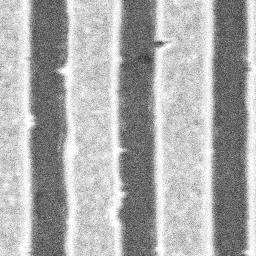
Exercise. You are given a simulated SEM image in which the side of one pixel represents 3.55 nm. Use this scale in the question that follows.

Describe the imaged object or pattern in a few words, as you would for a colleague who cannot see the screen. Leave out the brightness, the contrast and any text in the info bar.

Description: one or a few lines or trenches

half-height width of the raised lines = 0.182 micrometres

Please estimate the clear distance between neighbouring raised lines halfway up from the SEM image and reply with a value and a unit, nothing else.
142 nanometres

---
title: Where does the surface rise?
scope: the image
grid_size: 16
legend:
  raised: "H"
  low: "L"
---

HHLLHHHLLLHHHLLL
HHLLHHHLLLHHHLLL
HHLLHHHLLLHHHLLL
HHLLHHHLLLHHHLLL
HHLLHHHLLLHHHLLL
HHLLHHHLLLHHHLLL
HHLLHHHLLLHHHLLL
HHLLHHHLLLHHHLLL
HHLLHHHLLLHHHLLL
HHLLHHHLLLHHHLLL
HHLLHHHLLLHHHLLL
HHLLHHHLLLHHHLLL
HHLLHHHLLLHHHLLL
HHLLHHHLLLHHHLLL
HHLLHHHLLLHHHLLL
HHLLHHHLLLHHHLLL